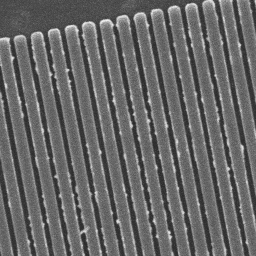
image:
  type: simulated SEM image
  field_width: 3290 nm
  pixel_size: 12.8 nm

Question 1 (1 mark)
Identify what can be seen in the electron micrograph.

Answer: parallel lines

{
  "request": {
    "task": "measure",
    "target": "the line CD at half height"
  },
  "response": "0.159 micrometres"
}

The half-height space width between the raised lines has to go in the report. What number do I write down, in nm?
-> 63.1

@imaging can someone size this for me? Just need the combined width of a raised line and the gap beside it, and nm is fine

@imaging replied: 224